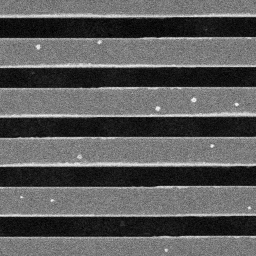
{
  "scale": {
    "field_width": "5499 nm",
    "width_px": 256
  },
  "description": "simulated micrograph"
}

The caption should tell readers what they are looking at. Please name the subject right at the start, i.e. lines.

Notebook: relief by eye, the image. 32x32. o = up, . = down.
oooooooooooooooooooooooooooooooo
oooooooooooooooooooooooooooooooo
................................
................................
................................
oooooooooooooooooooooooooooooooo
oooooooooooooooooooooooooooooooo
oooooooooooooooooooooooooooooooo
................................
................................
................................
oooooooooooooooooooooooooooooooo
oooooooooooooooooooooooooooooooo
oooooooooooooooooooooooooooooooo
oooooooooooooooooooooooooooooooo
................................
................................
oooooooooooooooooooooooooooooooo
oooooooooooooooooooooooooooooooo
oooooooooooooooooooooooooooooooo
oooooooooooooooooooooooooooooooo
................................
................................
oooooooooooooooooooooooooooooooo
oooooooooooooooooooooooooooooooo
oooooooooooooooooooooooooooooooo
oooooooooooooooooooooooooooooooo
................................
................................
................................
oooooooooooooooooooooooooooooooo
oooooooooooooooooooooooooooooooo